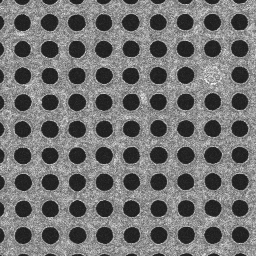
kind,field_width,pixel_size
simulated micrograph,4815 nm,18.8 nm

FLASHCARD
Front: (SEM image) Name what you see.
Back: a regular array of holes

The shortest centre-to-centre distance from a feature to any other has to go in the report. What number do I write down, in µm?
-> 0.498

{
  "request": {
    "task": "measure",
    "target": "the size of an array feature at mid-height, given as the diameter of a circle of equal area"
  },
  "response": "17.1 pixels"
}